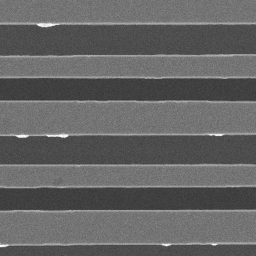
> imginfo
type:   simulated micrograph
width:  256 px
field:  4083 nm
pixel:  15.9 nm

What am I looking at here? lines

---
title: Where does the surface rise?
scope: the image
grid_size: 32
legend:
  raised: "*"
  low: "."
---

********************************
********************************
********************************
................................
................................
................................
................................
********************************
********************************
********************************
................................
................................
................................
********************************
********************************
********************************
********************************
................................
................................
................................
................................
********************************
********************************
................................
................................
................................
********************************
********************************
********************************
********************************
****************************....
................................